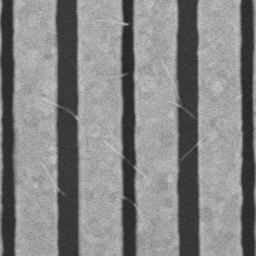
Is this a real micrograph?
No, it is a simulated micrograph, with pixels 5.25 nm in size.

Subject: lines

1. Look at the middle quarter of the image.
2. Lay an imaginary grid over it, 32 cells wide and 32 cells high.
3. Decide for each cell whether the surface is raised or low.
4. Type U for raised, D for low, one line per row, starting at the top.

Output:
DDDUUUUUUUUUUUDDDDUUUUUUUUUUDDDD
DDDUUUUUUUUUUUDDDDUUUUUUUUUUDDDD
DDDUUUUUUUUUUUUDDUUUUUUUUUUUDDDD
DDDUUUUUUUUUUUDDDUUUUUUUUUUUDDDD
DDDUUUUUUUUUUUDDDUUUUUUUUUUUDDDD
DDDUUUUUUUUUUUDDDDUUUUUUUUUUDDDD
DDDUUUUUUUUUUUDDDDUUUUUUUUUUDDDD
DDDDUUUUUUUUUUDDDDUUUUUUUUUUDDDD
DDDDUUUUUUUUUUUDDDUUUUUUUUUUUDDD
DDDDUUUUUUUUUUUDDDUUUUUUUUUUDDDD
DDDDUUUUUUUUUUUDDDUUUUUUUUUUUDDD
DDDUUUUUUUUUUUUDDDUUUUUUUUUUDDDD
DDDUUUUUUUUUUUUDDDUUUUUUUUUUDDDD
DDDUUUUUUUUUUUDDDDUUUUUUUUUUDDDD
DDDUUUUUUUUUUUDDDDUUUUUUUUUUDDDD
DDDUUUUUUUUUUUDDDDUUUUUUUUUUDDDD
DDDDUUUUUUUUUUDDDDUUUUUUUUUUDDDD
DDDUUUUUUUUUUUDDDDUUUUUUUUUUDDDD
DDDUUUUUUUUUUUDDDDUUUUUUUUUUDDDD
DDDDUUUUUUUUUUDDDDUUUUUUUUUUDDDD
DDDDUUUUUUUUUUUDDDUUUUUUUUUUDDDD
DDDDUUUUUUUUUUUDDDUUUUUUUUUUDDDD
DDDDUUUUUUUUUUDDDDUUUUUUUUUUDDDD
DDDDUUUUUUUUUUUDDDUUUUUUUUUUDDDD
DDDDUUUUUUUUUUDDDDUUUUUUUUUUDDDD
DDDDUUUUUUUUUUDDDDUUUUUUUUUUDDDD
DDDDUUUUUUUUUUUDDDUUUUUUUUUUUDDD
DDDDUUUUUUUUUUUDDDUUUUUUUUUUDDDD
DDDDUUUUUUUUUUUDDDUUUUUUUUUUDDDD
DDDDUUUUUUUUUUUDDDUUUUUUUUUUDDDD
DDDDUUUUUUUUUUUDDDUUUUUUUUUUDDDD
DDDDUUUUUUUUUUUDDDUUUUUUUUUUDDDD